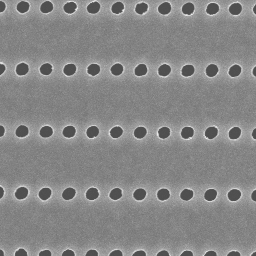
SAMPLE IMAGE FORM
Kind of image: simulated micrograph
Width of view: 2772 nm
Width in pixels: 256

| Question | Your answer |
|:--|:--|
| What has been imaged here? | a regular array of holes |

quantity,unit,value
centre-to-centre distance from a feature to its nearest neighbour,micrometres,0.254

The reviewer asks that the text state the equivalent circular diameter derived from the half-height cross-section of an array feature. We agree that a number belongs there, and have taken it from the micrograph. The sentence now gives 135 nanometers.